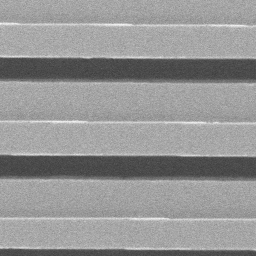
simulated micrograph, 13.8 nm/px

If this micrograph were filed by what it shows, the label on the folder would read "lines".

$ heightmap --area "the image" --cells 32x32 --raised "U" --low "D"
UUUUUUUUUUUUUUUUUUUUUUUUUUUUUUUU
UUUUUUUUUUUUUUUUUUUUUUUUUUUUUUUU
UUUUUUUUUUUUUUUUUUUUUUUUUUUUUUUU
UUUUUUUUUUUUUUUUUUUUUUUUUUUUUUUU
UUUUUUUUUUUUUUUUUUUUUUUUUUUUUUUU
UUUUUUUUUUUUUUUUUUUUUUUUUUUUUUUU
UUUUUUUUUUUUUUUUUUUUUUUUUUUUUUUU
DDDDDDDDDDDDDDDDDDDDDDDDDDDDDDDD
DDDDDDDDDDDDDDDDDDDDDDDDDDDDDDDD
DDDDDDDDDDDDDDDDDDDDDDDDDDDDDDDD
UUUUUUUUUUUUUUUUUUUUUUUUUUUUUUUU
UUUUUUUUUUUUUUUUUUUUUUUUUUUUUUUU
UUUUUUUUUUUUUUUUUUUUUUUUUUUUUUUU
UUUUUUUUUUUUUUUUUUUUUUUUUUUUUUUU
UUUUUUUUUUUUUUUUUUUUUUUUUUUUUUUU
UUUUUUUUUUUUUUUUUUUUUUUUUUUUUUUU
UUUUUUUUUUUUUUUUUUUUUUUUUUUUUUUU
UUUUUUUUUUUUUUUUUUUUUUUUUUUUUUUU
UUUUUUUUUUUUUUUUUUUUUUUUUUUUUUUU
DDDDDDDDDDDDDDDDDDDDDDDDDDDDDDDD
DDDDDDDDDDDDDDDDDDDDDDDDDDDDDDDD
DDDDDDDDDDDDDDDDDDDDDDDDDDDDDDDD
UUUUUUUUUUUUUUUDDDDDDDDDDDDDDDDD
UUUUUUUUUUUUUUUUUUUUUUUUUUUUUUUU
UUUUUUUUUUUUUUUUUUUUUUUUUUUUUUUU
UUUUUUUUUUUUUUUUUUUUUUUUUUUUUUUU
UUUUUUUUUUUUUUUUUUUUUUUUUUUUUUUU
UUUUUUUUUUUUUUUUUUUUUUUUUUUUUUUU
UUUUUUUUUUUUUUUUUUUUUUUUUUUUUUUU
UUUUUUUUUUUUUUUUUUUUUUUUUUUUUUUU
UUUUUUUUUUUUUUUUUUUUUUUUUUUUUUUU
DDDDDDDDDDDDDDDDDDDDDDDDDDDDDDDD